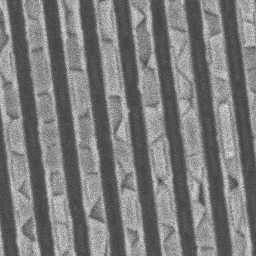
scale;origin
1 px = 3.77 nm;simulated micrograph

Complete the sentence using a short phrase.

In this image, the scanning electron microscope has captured parallel lines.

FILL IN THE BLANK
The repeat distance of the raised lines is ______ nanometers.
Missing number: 133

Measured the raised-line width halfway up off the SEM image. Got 83.1 nm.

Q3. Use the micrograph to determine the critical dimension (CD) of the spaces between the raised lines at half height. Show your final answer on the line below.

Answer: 13.6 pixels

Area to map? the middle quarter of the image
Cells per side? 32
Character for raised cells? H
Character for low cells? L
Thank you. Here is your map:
HHHHHHLLLHHHHHLLLLHHHHHLLLLHHHHH
LHHHHHLLLHHHHHHLLLHHHHHHLLLHHHHH
LHHHHHLLLLHHHHHLLLHHHHHHLLLHHHHH
LHHHHHLLLLHHHHHLLLLHHHHHLLLHHHHH
LHHHHHLLLLHHHHHLLLLHHHHHLLLLHHHH
LHHHHHLLLLHHHHHLLLHHHHHHLLLLHHHH
LHHHHHLLLLHHHHHLLLLHHHHHLLLLHHHH
LHHHHHHLLLHHHHHLLLLHHHHHLLLLHHHH
LHHHHHHLLLHHHHHHLLLHHHHHHLLLHHHH
LHHHHHHLLLHHHHHHLLLHHHHHHLLLHHHH
LLHHHHHLLLLHHHHHLLLHHHHHHLLLHHHH
LLHHHHHLLLLHHHHHLLLLHHHHHLLLLHHH
LLHHHHHLLLLHHHHHLLLLHHHHHLLLLHHH
LLHHHHHLLLLHHHHHLLLLHHHHHLLLLHHH
LLHHHHHHLLLHHHHHLLLLHHHHHLLLLHHH
LLHHHHHHLLLHHHHHLLLLHHHHHLLLLHHH
LLHHHHHHLLLHHHHHHLLLHHHHHHLLLHHH
LLHHHHHHLLLHHHHHHLLLHHHHHLLLLHHH
LLLHHHHHLLLHHHHHHLLLHHHHHHLLLHHH
LLLHHHHHLLLLHHHHHLLLLHHHHHLLLLHH
LLLHHHHHLLLLHHHHHLLLLHHHHHLLLLHH
LLLHHHHHHLLLHHHHHLLLLHHHHHLLLLHH
LLLHHHHHHLLLHHHHHLLLLHHHHHLLLLHH
LLLHHHHHHLLLHHHHHLLLLHHHHHLLLLHH
LLLHHHHHHLLLHHHHHHLLLHHHHHHLLLHH
LLLLHHHHHLLLLHHHHHLLLHHHHHHLLLHH
LLLLHHHHHLLLLHHHHHLLLLHHHHHLLLHH
LLLLHHHHHLLLLHHHHHLLLLHHHHHLLLLH
LLLLHHHHHLLLLHHHHHLLLLHHHHHLLLLH
LLLLHHHHHLLLLHHHHHLLLLHHHHHLLLLH
HLLLHHHHHHLLLHHHHHLLLLHHHHHLLLLH
HLLLHHHHHHLLLLHHHHHLLLHHHHHLLLLH